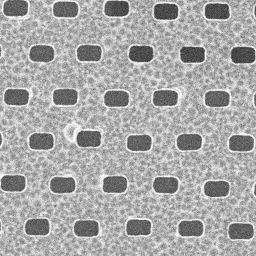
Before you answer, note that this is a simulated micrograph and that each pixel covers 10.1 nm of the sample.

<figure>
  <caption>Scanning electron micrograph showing a regular array of holes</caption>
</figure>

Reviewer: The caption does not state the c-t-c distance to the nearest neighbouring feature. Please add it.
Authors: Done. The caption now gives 494 nm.